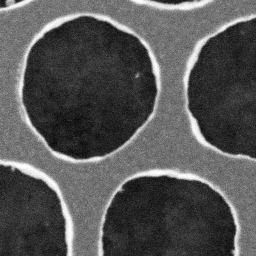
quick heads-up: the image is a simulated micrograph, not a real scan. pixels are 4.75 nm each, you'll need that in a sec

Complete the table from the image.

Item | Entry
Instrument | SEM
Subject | holes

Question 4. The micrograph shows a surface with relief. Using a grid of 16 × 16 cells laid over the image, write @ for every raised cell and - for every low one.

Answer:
@@@@@@@@@@@@@@@@
@@@@---@@@@@@@@-
@@-------@@@@---
@@-------@@@----
@@--------@@----
@---------@@----
@---------@@----
@@-------@@@----
@@@-----@@@@@---
@@@----@@@@@@@--
-@@@@@@@@@@@@@@@
---@@@@@-----@@@
----@@@-------@@
----@@@--------@
----@@---------@
----@@---------@